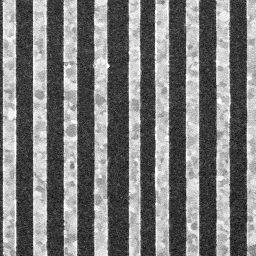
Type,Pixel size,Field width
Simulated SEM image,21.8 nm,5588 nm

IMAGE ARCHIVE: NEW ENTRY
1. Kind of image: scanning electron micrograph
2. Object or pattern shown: parallel lines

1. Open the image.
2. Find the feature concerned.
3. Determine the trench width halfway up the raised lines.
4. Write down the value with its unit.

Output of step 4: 396 nanometres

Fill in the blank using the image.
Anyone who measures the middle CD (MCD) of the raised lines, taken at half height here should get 267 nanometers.